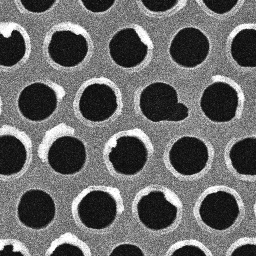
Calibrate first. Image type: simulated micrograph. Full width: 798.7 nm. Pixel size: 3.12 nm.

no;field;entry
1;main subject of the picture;a regular array of holes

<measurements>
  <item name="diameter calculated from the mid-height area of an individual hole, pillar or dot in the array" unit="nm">121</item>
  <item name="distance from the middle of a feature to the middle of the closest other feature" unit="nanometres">188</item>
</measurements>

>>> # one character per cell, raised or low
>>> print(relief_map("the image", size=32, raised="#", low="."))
###....###....####....####...###
####.#######.##############.####
################################
#######################.########
#..####...####...#####....###...
...###.....###....###.....###...
...###.....###....###.....###...
...####...####....####....###...
################################
################################
####.#######.######..#####..####
###....###....####....###.....##
##.....###.....##.....###.....##
##.....###.....###.....##.....##
###...####....####.....###...###
################################
################################
..#####...#####..#####...#####..
...###.....###....###.....###...
...###.....###....###.....###...
...###.....###....###.....###...
..#####...#####..#####...#####..
################################
################################
###...#####...####...#####...###
##.....###....###.....###.....##
##.....###.....##.....###.....##
##.....###....####....###.....##
####..#####..######..#####...###
################################
########.#######################
..#####...####....####...####...